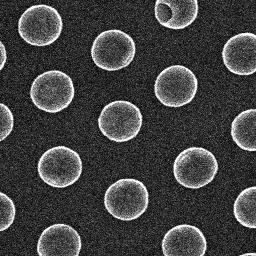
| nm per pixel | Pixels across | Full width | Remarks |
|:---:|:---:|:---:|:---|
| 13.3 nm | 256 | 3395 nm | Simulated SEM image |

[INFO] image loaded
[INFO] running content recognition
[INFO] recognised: a regular array of raised bodies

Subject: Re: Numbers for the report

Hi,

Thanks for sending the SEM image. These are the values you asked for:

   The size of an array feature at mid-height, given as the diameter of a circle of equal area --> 546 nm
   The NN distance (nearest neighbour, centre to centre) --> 0.916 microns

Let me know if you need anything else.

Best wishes